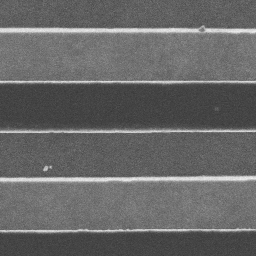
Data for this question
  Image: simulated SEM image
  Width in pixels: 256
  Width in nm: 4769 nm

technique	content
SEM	lines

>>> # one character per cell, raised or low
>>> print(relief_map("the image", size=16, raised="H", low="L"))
LLLLLLLLLLLLLLLL
LLLLLLLLLLLLLLLL
HHHHHHHHHHHHHHHH
HHHHHHHHHHHHHHHH
HHHHHHHHHHHHHHHH
HHHHHHHHHHHHHHHH
HHHHHHHHHHHHHHHH
HHHHHHHHHHHHHHHH
LLLLLLLLLLLLLLLL
LLLLLLLLLLLLLLLL
LLLLLLLLLLLLLLLL
HHHHHHHHHHHHHHHH
HHHHHHHHHHHHHHHH
HHHHHHHHHHHHHHHH
HHHHHHHHHHHHHHHH
HHHHHHHHHHHHHHHH